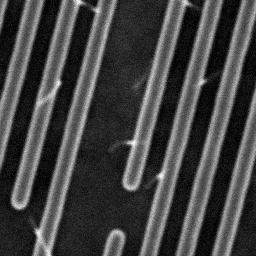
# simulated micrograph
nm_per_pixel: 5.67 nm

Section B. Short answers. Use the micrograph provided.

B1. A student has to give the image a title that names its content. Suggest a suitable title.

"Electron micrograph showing groups of lines, slits or small figures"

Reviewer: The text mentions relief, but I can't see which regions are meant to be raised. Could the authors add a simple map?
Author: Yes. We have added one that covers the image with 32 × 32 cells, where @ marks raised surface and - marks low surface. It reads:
@--@@---@@--@@-------@@---@@--@@
---@@--@@@--@@-------@@--@@---@@
---@@--@@---@@-------@@--@@---@@
--@@@--@@--@@@------@@---@@--@@-
--@@---@@--@@-------@@---@@--@@-
--@@--@@@--@@-------@@--@@---@@-
--@@--@@---@@-------@@--@@---@@-
-@@@--@@--@@@------@@---@@--@@--
-@@---@@--@@-------@@---@@--@@--
-@@--@@@--@@-------@@--@@---@@--
-@@--@@---@@-------@@--@@---@@--
@@---@@--@@@------@@---@@--@@---
@@---@@--@@-------@@--@@@--@@---
@@--@@@--@@-------@@--@@---@@--@
@@--@@---@@-------@@--@@---@@--@
@---@@--@@-------@@---@@--@@---@
@---@@--@@-------@@--@@@--@@---@
@--@@---@@-------@@--@@---@@--@@
@--@@---@@-------@@--@@---@@--@@
---@@--@@-------@@---@@--@@---@@
---@@--@@-------@@--@@---@@---@@
--@@---@@-------@@--@@---@@--@@-
--@@---@@------@@@--@@--@@@--@@-
--@@--@@--------@---@@--@@---@@-
--@@--@@-----------@@---@@---@@-
--@---@@-----------@@---@@--@@--
------@@-----------@@--@@---@@--
-----@@------------@@--@@---@@--
-----@@-----------@@---@@--@@@--
-----@@-------@@--@@---@@--@@---
-----@@------@@---@@--@@---@@---
----@@-------@@---@@--@@---@@---